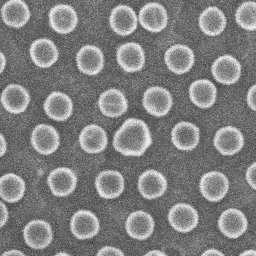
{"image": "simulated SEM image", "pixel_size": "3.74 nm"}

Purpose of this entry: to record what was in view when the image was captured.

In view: a regular array of raised bodies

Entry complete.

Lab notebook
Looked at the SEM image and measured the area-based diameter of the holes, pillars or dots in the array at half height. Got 103 nanometres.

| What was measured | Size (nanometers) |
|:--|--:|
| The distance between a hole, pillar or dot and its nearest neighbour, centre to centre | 154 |